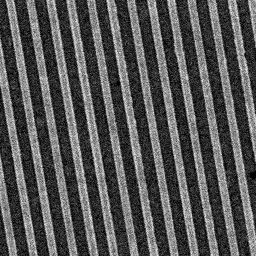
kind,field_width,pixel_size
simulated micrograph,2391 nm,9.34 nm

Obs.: parallel lines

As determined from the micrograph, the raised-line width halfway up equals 58.7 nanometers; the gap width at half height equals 0.125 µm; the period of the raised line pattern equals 186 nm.